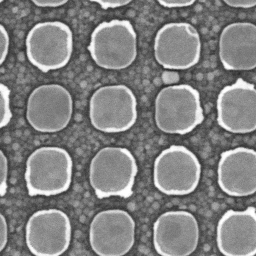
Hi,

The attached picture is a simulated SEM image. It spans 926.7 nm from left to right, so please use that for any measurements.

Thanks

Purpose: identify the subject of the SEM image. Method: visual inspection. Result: a regular array of raised bodies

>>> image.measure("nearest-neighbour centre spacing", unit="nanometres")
228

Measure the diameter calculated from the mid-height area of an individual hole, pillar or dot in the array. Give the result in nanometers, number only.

176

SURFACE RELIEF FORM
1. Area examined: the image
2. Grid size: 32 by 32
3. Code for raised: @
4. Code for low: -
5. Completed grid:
-----@@@----@@@@----@@@@-----@@@
--------------------------------
--------------------------------
----@@@@@---@@@@@---@@@@-----@@@
@--@@@@@@--@@@@@@---@@@@@---@@@@
@--@@@@@@--@@@@@@--@@@@@@---@@@@
@--@@@@@@--@@@@@@--@@@@@@---@@@@
----@@@@@---@@@@@---@@@@@---@@@@
-----@@------@@------@@-----@@@@
---------------------@----------
---------------------@-------@@-
@---@@@@----@@@@----@@@@@---@@@@
@---@@@@@---@@@@@---@@@@@--@@@@@
@--@@@@@@--@@@@@@---@@@@@--@@@@@
@--@@@@@@--@@@@@@--@@@@@@--@@@@@
@---@@@@----@@@@@---@@@@@--@@@@@
---------------------@@@--------
--------------------------------
------@------@@------@@---------
@---@@@@@---@@@@@---@@@@----@@@@
@--@@@@@@--@@@@@@--@@@@@@--@@@@@
@--@@@@@@--@@@@@@--@@@@@@--@@@@@
@--@@@@@@--@@@@@@--@@@@@@--@@@@@
@--@@@@@----@@@@----@@@@----@@@@
------------@@-@----------------
--------------------------------
-----@@@-----@@-------@-----@@@@
----@@@@@---@@@@@---@@@@---@@@@@
@--@@@@@@--@@@@@@--@@@@@@--@@@@@
@--@@@@@@--@@@@@@--@@@@@@--@@@@@
@--@@@@@@--@@@@@@--@@@@@@--@@@@@
----@@@@----@@@@----@@@@----@@@@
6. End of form